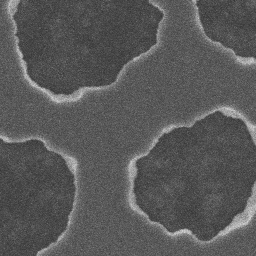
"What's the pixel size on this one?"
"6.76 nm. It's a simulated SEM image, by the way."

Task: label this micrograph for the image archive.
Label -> holes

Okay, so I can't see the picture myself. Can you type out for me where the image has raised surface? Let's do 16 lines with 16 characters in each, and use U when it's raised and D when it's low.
UDDDDDDDDDUUDDDD
UDDDDDDDDDUUUDDD
UDDDDDDDDDUUUDDD
UDDDDDDDDUUUUUUD
UUDDDDDDUUUUUUUU
UUUDDDUUUUUUUUUU
UUUUUUUUUUUUUUUU
UUUUUUUUUUUUDDDU
UUUUUUUUUUDDDDDD
DDDUUUUUUDDDDDDD
DDDDDUUUDDDDDDDD
DDDDDUUUDDDDDDDD
DDDDDUUUDDDDDDDD
DDDDUUUUUDDDDDDU
DDDDUUUUUUUUDDUU
DDDUUUUUUUUUUUUU